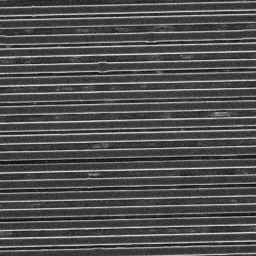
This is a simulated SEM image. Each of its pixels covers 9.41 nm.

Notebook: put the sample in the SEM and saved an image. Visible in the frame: parallel lines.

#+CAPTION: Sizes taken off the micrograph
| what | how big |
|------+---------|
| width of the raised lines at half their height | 84.7 nm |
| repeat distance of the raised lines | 14.4 px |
